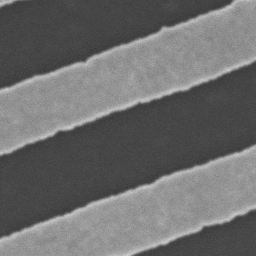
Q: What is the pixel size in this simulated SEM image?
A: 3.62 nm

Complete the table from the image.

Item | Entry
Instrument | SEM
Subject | one or a few lines or trenches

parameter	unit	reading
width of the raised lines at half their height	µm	0.216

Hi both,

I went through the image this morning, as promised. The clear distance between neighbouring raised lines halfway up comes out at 79.4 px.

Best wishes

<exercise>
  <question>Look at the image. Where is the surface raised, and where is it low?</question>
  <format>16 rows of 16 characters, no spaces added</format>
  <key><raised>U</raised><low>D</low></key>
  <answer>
DDDDDDDDDDDDDDUU
DDDDDDDDDDDUUUUU
DDDDDDDDDUUUUUUU
DDDDDDUUUUUUUUUU
DDDUUUUUUUUUUUDD
DUUUUUUUUUUUDDDD
UUUUUUUUDDDDDDDD
UUUUUUDDDDDDDDDD
UUUDDDDDDDDDDDDD
DDDDDDDDDDDDDDDU
DDDDDDDDDDDDUUUU
DDDDDDDDDUUUUUUU
DDDDDDUUUUUUUUUU
DDDDUUUUUUUUUUUD
DUUUUUUUUUUUDDDD
UUUUUUUUUDDDDDDD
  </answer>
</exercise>